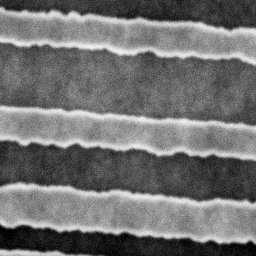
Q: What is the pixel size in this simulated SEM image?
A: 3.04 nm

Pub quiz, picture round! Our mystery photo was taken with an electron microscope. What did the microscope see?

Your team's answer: lines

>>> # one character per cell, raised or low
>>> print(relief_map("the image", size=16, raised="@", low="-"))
----------------
@@@@@@@@@@@@----
@@@@@@@@@@@@@@@@
----------@@@@@@
----------------
----------------
----------------
@@@@@@@@@@@-----
@@@@@@@@@@@@@@@@
---------@@@@@@@
----------------
----------------
@@@@@@@@@@@@----
@@@@@@@@@@@@@@@@
-------@@@@@@@@@
----------------